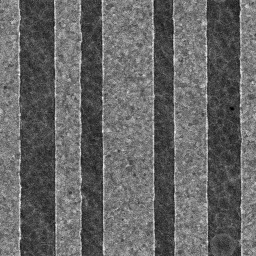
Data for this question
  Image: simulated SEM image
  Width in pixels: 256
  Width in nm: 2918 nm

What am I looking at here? one or a few lines or trenches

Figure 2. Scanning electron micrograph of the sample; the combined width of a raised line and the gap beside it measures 700 nanometres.